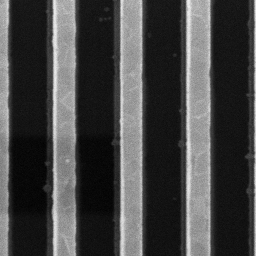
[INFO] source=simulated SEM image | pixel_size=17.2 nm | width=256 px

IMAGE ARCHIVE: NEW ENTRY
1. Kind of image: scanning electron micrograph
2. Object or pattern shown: lines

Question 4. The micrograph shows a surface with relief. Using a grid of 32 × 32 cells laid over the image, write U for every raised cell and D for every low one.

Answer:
UDDDDDUUUDDDDDUUUUDDDDDUUUDDDDDU
UDDDDDUUUDDDDDUUUUDDDDDUUUDDDDDU
UDDDDDUUUDDDDDUUUUDDDDDUUUDDDDDU
UDDDDDUUUDDDDDUUUUDDDDDUUUDDDDDU
UDDDDDUUUDDDDDUUUUDDDDDUUUDDDDDU
UDDDDDUUUDDDDDUUUUDDDDDUUUDDDDDU
UDDDDDUUUDDDDDUUUUDDDDDUUUDDDDDU
UDDDDDUUUDDDDDUUUUDDDDDUUUDDDDDU
UDDDDDUUUDDDDDUUUUDDDDDUUUDDDDDU
UDDDDDUUUDDDDDUUUUDDDDDUUUDDDDDU
UDDDDDUUUDDDDDUUUUDDDDDUUUDDDDDU
UDDDDDUUUDDDDDUUUUDDDDDUUUDDDDDU
UDDDDDUUUDDDDDUUUUDDDDDUUUDDDDDU
UDDDDDUUUDDDDDUUUUDDDDDUUUDDDDDU
UDDDDDUUUDDDDDUUUUDDDDDUUUDDDDDU
UDDDDDUUUDDDDDUUUUDDDDDUUUDDDDDU
UDDDDDUUUDDDDDUUUUDDDDDUUUDDDDDU
UDDDDDUUUDDDDDUUUUDDDDDUUUDDDDDU
UDDDDDUUUDDDDDUUUUDDDDDUUUDDDDDU
UDDDDDUUUDDDDDUUUUDDDDDUUUDDDDDU
UDDDDDUUUDDDDDUUUUDDDDDUUUDDDDDU
UDDDDDUUUDDDDDUUUUDDDDDUUUDDDDDU
UDDDDDUUUDDDDDUUUUDDDDDUUUDDDDDU
UDDDDDUUUDDDDDUUUUDDDDDUUUDDDDDU
UDDDDDUUUDDDDDUUUUDDDDDUUUDDDDDU
UDDDDDUUUDDDDDUUUUDDDDDUUUDDDDDU
UDDDDDUUUDDDDDUUUUDDDDDUUUDDDDDU
UDDDDDUUUDDDDDUUUUDDDDDUUUDDDDDU
UDDDDDUUUDDDDDUUUUDDDDDUUUDDDDDU
UDDDDDUUUDDDDDUUUUDDDDDUUUDDDDDU
UDDDDDUUUDDDDDUUUUDDDDDUUUDDDDDU
UDDDDDUUUDDDDDUUUUDDDDDUUUDDDDDU